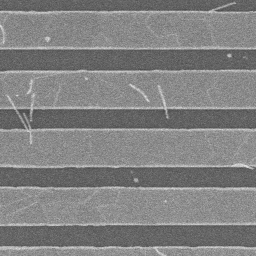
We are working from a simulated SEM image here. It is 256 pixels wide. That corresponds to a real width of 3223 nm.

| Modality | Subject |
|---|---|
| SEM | lines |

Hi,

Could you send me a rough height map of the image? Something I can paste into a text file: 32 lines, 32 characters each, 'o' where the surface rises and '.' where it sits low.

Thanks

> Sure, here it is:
................................
oo.....ooooo..ooooooooooo.o.....
oooooooooooooooooooooooooooooooo
oooooooooooooooooooooooooooooooo
oooooooooooooooooooooooooooooooo
oooooooooooooooooooooooooooooooo
................................
................................
................................
oooooooooooooooooooooooooooooooo
oooooooooooooooooooooooooooooooo
oooooooooooooooooooooooooooooooo
oooooooooooooooooooooooooooooooo
ooooooooooo.oooooooooooooooooooo
................................
................................
oooooooooooooooooooooooooooooooo
oooooooooooooooooooooooooooooooo
oooooooooooooooooooooooooooooooo
oooooooooooooooooooooooooooooooo
oooooooooooooooooooooooooooooooo
................................
................................
oo..........oooo................
oooooooooooooooooooooooooooooooo
oooooooooooooooooooooooooooooooo
oooooooooooooooooooooooooooooooo
oooooooooooooooooooooooooooooooo
................................
................................
................................
oooooooooooooooooooooooooooooooo